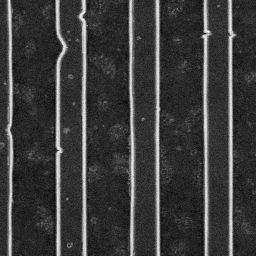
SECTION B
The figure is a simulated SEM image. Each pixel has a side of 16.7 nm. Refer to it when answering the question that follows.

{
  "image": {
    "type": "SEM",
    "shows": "one or a few lines or trenches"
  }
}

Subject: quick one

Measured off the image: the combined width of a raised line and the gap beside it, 1230 nm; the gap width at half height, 798 nanometers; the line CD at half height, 26.4 pixels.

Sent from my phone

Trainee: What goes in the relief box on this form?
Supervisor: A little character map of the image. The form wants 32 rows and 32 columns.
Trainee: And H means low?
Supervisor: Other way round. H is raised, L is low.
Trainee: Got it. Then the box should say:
HLLLLLLHHHLLLLLLHHHHLLLLLLHHHLLL
HLLLLLLHHHLLLLLLHHHHLLLLLLHHHLLL
HLLLLLLHHHLLLLLLHHHHLLLLLLHHHLLL
HLLLLLLHHHLLLLLLHHHHLLLLLLHHHLLL
HLLLLLLHHHHLLLLLHHHHLLLLLLHHHLLL
HLLLLLLLHHHLLLLLHHHHLLLLLLHHHLLL
HLLLLLLLHHHLLLLLHHHHLLLLLLHHHLLL
HLLLLLLHHHHLLLLLHHHHLLLLLLHHHLLL
HLLLLLLHHHHLLLLLHHHHLLLLLLHHHLLL
HLLLLLLHHHHLLLLLHHHHLLLLLLHHHLLL
HLLLLLLHHHLLLLLLHHHHLLLLLLHHHLLL
HLLLLLLHHHLLLLLLHHHHLLLLLLHHHLLL
HLLLLLLHHHLLLLLLHHHHLLLLLLHHHLLL
HLLLLLLHHHLLLLLLHHHHLLLLLLHHHLLL
HLLLLLLHHHLLLLLLHHHHLLLLLLHHHLLL
HLLLLLLHHHLLLLLLHHHHLLLLLLHHHLLL
HLLLLLLHHHLLLLLLHHHHLLLLLLHHHLLL
HLLLLLLHHHLLLLLLLHHHLLLLLLHHHLLL
HLLLLLLHHHLLLLLLLHHHLLLLLLHHHLLL
HLLLLLLHHHHLLLLLLHHHLLLLLLHHHLLL
HLLLLLLHHHHLLLLLLHHHLLLLLLHHHLLL
HLLLLLLHHHHLLLLLLHHHLLLLLLHHHLLL
HLLLLLLHHHHLLLLLLHHHLLLLLLHHHLLL
HLLLLLLHHHHLLLLLLHHHLLLLLLHHHLLL
HLLLLLLHHHHLLLLLLHHHLLLLLLHHHLLL
HLLLLLLHHHHLLLLLLHHHLLLLLLHHHLLL
HLLLLLLHHHHLLLLLLHHHLLLLLLHHHLLL
HLLLLLLHHHHLLLLLLHHHLLLLLLHHHLLL
HLLLLLLHHHHLLLLLLHHHLLLLLLHHHLLL
HLLLLLLHHHHLLLLLLHHHLLLLLLHHHLLL
HLLLLLLHHHHLLLLLLHHHLLLLLLHHHLLL
HLLLLLLHHHHLLLLLLHHHLLLLLLHHHLLL